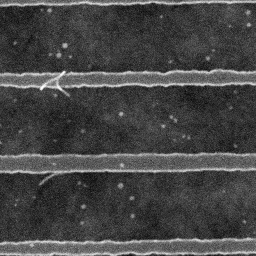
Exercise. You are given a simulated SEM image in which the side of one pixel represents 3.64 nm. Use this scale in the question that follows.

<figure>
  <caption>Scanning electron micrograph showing lines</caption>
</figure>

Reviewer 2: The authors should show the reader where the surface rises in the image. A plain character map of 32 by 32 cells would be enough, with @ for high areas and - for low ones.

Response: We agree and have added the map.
@@@@@@@@@---@@-@@---------------
--------------------------------
--------------------------------
--------------------------------
--------------------------------
--------------------------------
--------------------------------
--------------------------------
--------------------------------
@@@@@@@@@@@@@@@@@@@@@@@@@@@@@@@@
@@@@@@@@@@@@@@@@@@@@@@@@@@@@@@@@
--------------------------------
--------------------------------
--------------------------------
--------------------------------
--------------------------------
--------------------------------
--------------------------------
--------------------------------
@@@@@@@@@@@@@@@@@@@@@@@@@@@@@@@@
@@@@@@@@@@@@@@@@@@@@@@@@@@@@@@@@
-@-@@@--------------------------
--------------------------------
--------------------------------
--------------------------------
--------------------------------
--------------------------------
--------------------------------
--------------------------------
--------------------------------
@@@@@@@@@@@@@@@@@@@@@@@@@@@@@@@@
@@@@@@@@@@@@@@@@@@@@@@@@@@@@@@@@